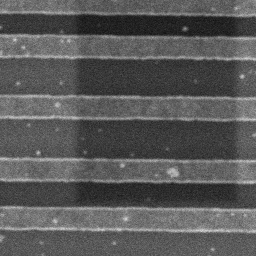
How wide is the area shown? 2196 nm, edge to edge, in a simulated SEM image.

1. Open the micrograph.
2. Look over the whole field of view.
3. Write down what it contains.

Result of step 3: lines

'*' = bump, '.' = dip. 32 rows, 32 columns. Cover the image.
********************************
********************************
................................
................................
**************..................
********************************
********************************
................................
................................
................................
................................
................................
********************************
********************************
********************************
................................
................................
................................
................................
................................
********************************
********************************
********************************
................................
................................
................................
********************************
********************************
********************************
................................
................................
................................